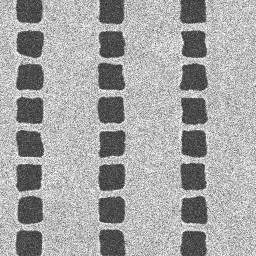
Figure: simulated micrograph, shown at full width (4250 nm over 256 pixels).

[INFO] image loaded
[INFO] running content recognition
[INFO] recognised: a regular array of holes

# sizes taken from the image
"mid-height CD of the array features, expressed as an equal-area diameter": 482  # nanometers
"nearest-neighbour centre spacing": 549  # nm